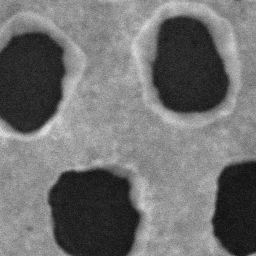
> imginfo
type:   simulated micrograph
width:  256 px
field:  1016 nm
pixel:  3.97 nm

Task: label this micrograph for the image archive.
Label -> holes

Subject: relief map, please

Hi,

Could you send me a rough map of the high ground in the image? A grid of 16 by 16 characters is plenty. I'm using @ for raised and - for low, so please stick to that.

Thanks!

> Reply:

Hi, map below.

@@@@@@@@@@@@@@@@
@-@@@@@@@@---@@@
----@@@@@-----@@
----@@@@@-----@@
----@@@@@-----@@
----@@@@@-----@@
----@@@@@@----@@
---@@@@@@@@@@@@@
@@@@@@@@@@@@@@@@
@@@@@@@@@@@@@@@@
@@@@@@--@@@@@@--
@@@-----@@@@@@--
@@@------@@@@---
@@@------@@@@---
@@@------@@@@---
@@@@----@@@@@@--